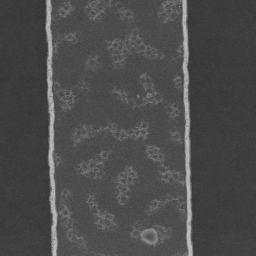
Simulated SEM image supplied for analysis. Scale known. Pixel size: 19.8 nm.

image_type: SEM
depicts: one or a few lines or trenches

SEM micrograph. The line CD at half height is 136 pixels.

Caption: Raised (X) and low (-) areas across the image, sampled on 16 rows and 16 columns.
---XXXXXXXX-----
---XXXXXXXXX----
---XXXXXXXXX----
---XXXXXXXXX----
---XXXXXXXXX----
---XXXXXXXXX----
---XXXXXXXXX----
---XXXXXXXXX----
---XXXXXXXXX----
---XXXXXXXXX----
---XXXXXXXXX----
---XXXXXXXXX----
---XXXXXXXXX----
---XXXXXXXXX----
---XXXXXXXXX----
---XXXXXXXXX----